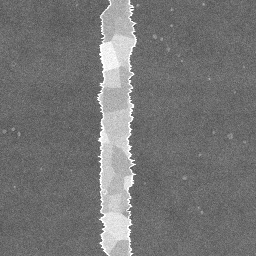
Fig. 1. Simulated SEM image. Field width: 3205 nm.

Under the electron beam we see one or a few lines or trenches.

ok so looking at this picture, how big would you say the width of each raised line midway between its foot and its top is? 366 nm